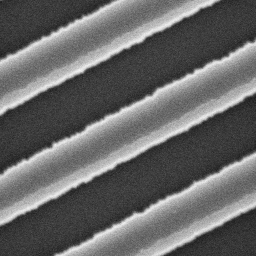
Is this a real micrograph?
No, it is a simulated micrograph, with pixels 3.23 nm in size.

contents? lines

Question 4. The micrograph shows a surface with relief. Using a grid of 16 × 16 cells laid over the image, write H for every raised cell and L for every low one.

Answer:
LLLLLLLHHHHHLLLL
LLLLLHHHHHHLLLLL
LLLHHHHHHLLLLLLL
LHHHHHHLLLLLLLHH
HHHHHLLLLLLLHHHH
HHHLLLLLLLHHHHHH
HLLLLLLLLHHHHHLL
LLLLLLLHHHHHHLLL
LLLLLHHHHHHLLLLL
LLLHHHHHHLLLLLLL
LHHHHHHLLLLLLLHH
HHHHHLLLLLLLHHHH
HHHLLLLLLLHHHHHH
HLLLLLLLLHHHHHHL
LLLLLLLHHHHHHLLL
LLLLLHHHHHHLLLLL